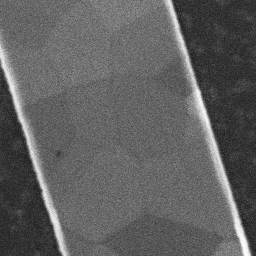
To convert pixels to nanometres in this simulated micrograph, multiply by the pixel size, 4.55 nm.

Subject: one or a few lines or trenches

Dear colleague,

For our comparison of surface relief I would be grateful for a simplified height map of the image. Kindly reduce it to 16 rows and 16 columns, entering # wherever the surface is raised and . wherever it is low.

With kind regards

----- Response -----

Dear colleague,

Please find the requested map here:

###########.....
###########.....
###########.....
############....
############....
.###########....
.############...
.############...
..###########...
..############..
..############..
...###########..
...############.
...############.
....###########.
....###########.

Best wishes